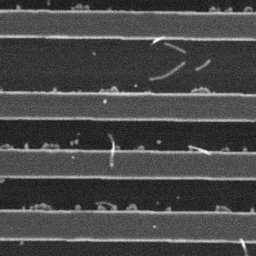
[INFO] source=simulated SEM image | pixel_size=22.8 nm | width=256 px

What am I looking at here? lines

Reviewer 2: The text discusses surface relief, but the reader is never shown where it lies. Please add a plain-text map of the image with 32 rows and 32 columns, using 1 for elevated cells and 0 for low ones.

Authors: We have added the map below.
00000000000000000000000000000000
11111111111111111111111000000000
11111111111111111111111111111111
11111111111111111111111111111111
11111111111111111111111111111111
00000000000000000000000000000000
00000000000000000000000000000000
00000000000000000000000000000000
00000000000000000000000000000000
00000000000000000000000000000000
00000000000000000000000000000000
00000000000000000000000000000000
11111111111111111111111111111111
11111111111111111111111111111111
11111111111111111111111111111111
00000000000000000000000000000000
00000000000000000000000000000000
00000000000000000000000000000000
00000000000000000000000000000000
11111111111111111111111111111111
11111111111111111111111111111111
11111111111111111111111111111111
00000000000000000000000000000000
00000000000000000000000000000000
00000000000000000000000000000000
00000000000000000000000000000000
11111111111111111100000000000000
11111111111111111111111111111111
11111111111111111111111111111111
11111111111111111111111111111111
00000000000000000000000000000000
00000000000000000000000000000000